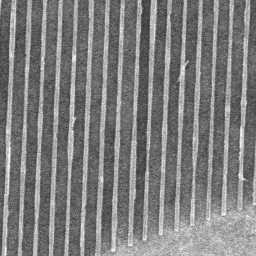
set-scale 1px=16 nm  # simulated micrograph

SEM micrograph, parallel lines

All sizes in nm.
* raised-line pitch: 249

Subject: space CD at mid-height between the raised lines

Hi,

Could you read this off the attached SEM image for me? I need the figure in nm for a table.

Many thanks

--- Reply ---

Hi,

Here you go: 186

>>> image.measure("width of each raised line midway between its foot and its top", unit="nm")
55.9